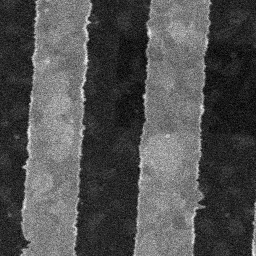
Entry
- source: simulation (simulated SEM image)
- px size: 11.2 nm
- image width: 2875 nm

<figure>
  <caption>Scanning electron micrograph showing one or a few lines or trenches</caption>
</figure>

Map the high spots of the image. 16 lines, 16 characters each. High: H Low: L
LLHHHHLLLHHHHLLL
LLHHHLLLLHHHHLLL
LLHHHLLLLHHHHLLL
LLHHHLLLLHHHHLLL
LLHHHLLLLHHHHLLL
LLHHHLLLLHHHHLLL
LLHHHLLLLHHHHLLL
LLHHHLLLLHHHHLLL
LLHHHLLLLHHHHLLL
LLHHHLLLLHHHHLLL
LLHHHLLLLHHHLLLL
LLHHHLLLLHHHLLLL
LLHHHLLLLHHHHLLL
LHHHHLLLLHHHLLLL
LHHHHLLLLHHHLLLL
LLHHHLLLHHHHLLLL